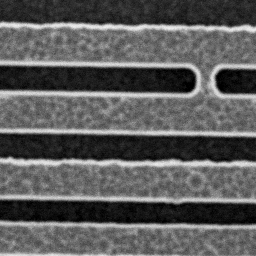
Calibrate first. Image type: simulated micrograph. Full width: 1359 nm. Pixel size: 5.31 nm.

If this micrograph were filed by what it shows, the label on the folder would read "one or a few lines or trenches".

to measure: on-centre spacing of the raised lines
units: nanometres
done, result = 359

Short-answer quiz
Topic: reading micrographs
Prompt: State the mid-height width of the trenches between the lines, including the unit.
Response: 28.4 px